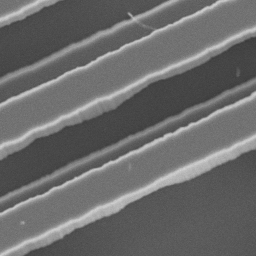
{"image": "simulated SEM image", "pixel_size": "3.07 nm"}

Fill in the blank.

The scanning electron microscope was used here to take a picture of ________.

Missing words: lines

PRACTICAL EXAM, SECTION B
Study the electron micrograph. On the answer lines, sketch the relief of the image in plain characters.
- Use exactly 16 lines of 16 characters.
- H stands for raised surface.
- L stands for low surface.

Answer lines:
HHLLLLLLLLHHHHHH
LLLLLLLLHHHHHHHH
LLLLLLHHHHHHHHHL
LLLLHHHHHHHHHLLL
LHHHHHHHHHLLLLLL
HHHHHHHHLLLLLLLH
HHHHHHLLLLLLLHHH
HHHHLLLLLLLHHHHH
HHLLLLLLLHHHHHHH
LLLLLLLHHHHHHHLL
LLLLHHHHHHHHLLLL
LLHHHHHHHHLLLLLL
HHHHHHHHLLLLLLLL
HHHHHHLLLLLLLLLL
HHHHLLLLLLLLLLLL
HLLLLLLLLLLLLLLL